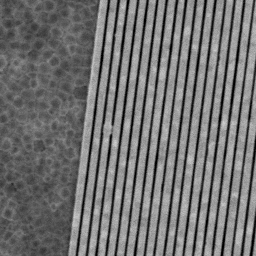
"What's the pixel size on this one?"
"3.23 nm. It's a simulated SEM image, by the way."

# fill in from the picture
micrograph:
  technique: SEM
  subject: parallel lines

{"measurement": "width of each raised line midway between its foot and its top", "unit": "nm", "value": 22.4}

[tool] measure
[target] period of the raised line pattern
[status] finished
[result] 9.63 pixels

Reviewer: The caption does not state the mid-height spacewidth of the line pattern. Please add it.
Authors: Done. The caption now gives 8.4 nanometres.